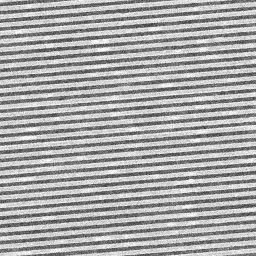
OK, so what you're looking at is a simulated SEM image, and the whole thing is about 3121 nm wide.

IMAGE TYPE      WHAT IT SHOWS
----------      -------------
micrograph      parallel lines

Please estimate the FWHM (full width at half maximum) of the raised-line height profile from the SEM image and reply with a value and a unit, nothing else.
45.5 nm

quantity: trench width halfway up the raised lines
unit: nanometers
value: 51.6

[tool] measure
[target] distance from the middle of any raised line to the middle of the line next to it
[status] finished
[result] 99.8 nm